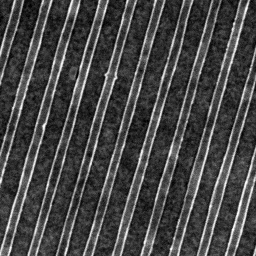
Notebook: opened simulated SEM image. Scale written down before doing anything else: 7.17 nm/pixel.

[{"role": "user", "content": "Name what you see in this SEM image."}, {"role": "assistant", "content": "parallel lines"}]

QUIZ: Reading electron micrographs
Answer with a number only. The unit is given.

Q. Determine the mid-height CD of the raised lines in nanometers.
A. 58.7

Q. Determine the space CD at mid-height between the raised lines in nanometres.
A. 136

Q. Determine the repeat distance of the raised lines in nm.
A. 195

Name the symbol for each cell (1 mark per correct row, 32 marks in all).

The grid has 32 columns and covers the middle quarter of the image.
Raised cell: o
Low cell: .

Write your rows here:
....oo.....ooo.....oo.....oo....
..o.oo.....oo.....oo.....ooo....
..oooo.....oo.....oo.....oo.....
...oo......oo.....oo.....oo.....
...oo.....oo.....oo.....ooo....o
...oo.....oo.....oo.....oo.....o
...oo.....oo.....oo.....oo.....o
..oo.....ooo.....oo.....oo.....o
..oo.....oo.....oo.....oo.....oo
..oo.....oo.....oo.....oo.....oo
..oo....ooo.....oo.....oo.....oo
.oo.....oo.....oo.....ooo....ooo
.oo.....oo.....oo.....oo.....oo.
.oo.....oo.....oo.....oo.....oo.
.oo....ooo.....oo.....oo.....oo.
oo.....oo.....oo.....oo.....oo..
oo.....oo.....oo.....oo.....oo..
oo....ooo.....oo.....oo.....oo..
o.....ooo....ooo....ooo.....oo..
o.....oo.....oo.....oo.....oo...
o.....oo.....oo.....oo.....oo...
o....ooo.....oo.....oo.....oo...
.....oo.....oo.....oo.....oo....
.....oo.....oo.....oo.....oo....
.....oo.....oo.....oo.....oo....
....ooo.....oo.....oo.....oo....
....oo.....oo.....oo.....oo.....
....oo.....oo.....oo.....oo.....
....oo.....oo....ooo....ooo....o
...oo.....oo.....oo.....ooo....o
...oo.....oo.....oo.....oo.....o
...oo.....oo.....oo.....oo.....o